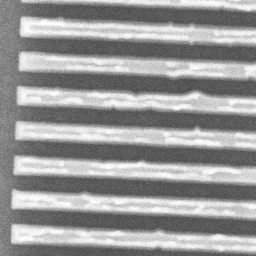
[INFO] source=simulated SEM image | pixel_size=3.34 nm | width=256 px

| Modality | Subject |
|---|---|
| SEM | parallel lines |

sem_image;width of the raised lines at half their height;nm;51.2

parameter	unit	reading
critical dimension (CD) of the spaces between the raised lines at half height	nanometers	64.1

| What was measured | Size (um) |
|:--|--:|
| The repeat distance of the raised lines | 0.115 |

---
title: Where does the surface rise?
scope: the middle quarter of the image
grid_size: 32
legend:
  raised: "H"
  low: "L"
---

HHHHHHHHHHHHHHHHHHHHHHHHHHHHHHHH
LHHHHHHHHHHHHHHHHHHHHHHHHHHHHHHH
LLLLLLLLLLLLLLLLLLLHHHHHHHHHHHHH
LLLLLLLLLLLLLLLLLLLLLLLLLLLLLLLL
LLLLLLLLLLLLLLLLLLLLLLLLLLLLLLLL
LLLLLLLLLLLLLLLLLLLLLLLLLLLLLLLL
LLLLLLLLLLLLLLLLLLLLLLLLLLLLLLLL
HHHHHHHHHHHHHHHHHLLLLLLLLLLLLLLH
HHHHHHHHHHHHHHHHHHHHHHHHHHHHHHHH
HHHHHHHHHHHHHHHHHHHHHHHHHHHHHHHH
LLLLLLLLHHHHHHHHHHHHHHHHHHHHHHHH
LLLLLLLLLLLLLLLLLLLLLLLLLLHLLLLH
LLLLLLLLLLLLLLLLLLLLLLLLLLLLLLLL
LLLLLLLLLLLLLLLLLLLLLLLLLLLLLLLL
LLLLLLLLLLLLLLLLLLLLLLLLLLLLLLLL
HHLLLLLLLLLLLLLLLLLLLLLLLLLLLLLL
HHHHHHHHHHHHHHHHHHHHHHHHHLLLLLLL
HHHHHHHHHHHHHHHHHHHHHHHHHHHHHHHH
HHHHHHHHHHHHHHHHHHHHHHHHHHHHHHHH
LLLLLLLLLLLHLLLLHHHHHHHHHHHHHHHH
LLLLLLLLLLLLLLLLLLLLLLLLLLLLLLLL
LLLLLLLLLLLLLLLLLLLLLLLLLLLLLLLL
LLLLLLLLLLLLLLLLLLLLLLLLLLLLLLLL
LLLLLLLLLLLLLLLLLLLLLLLLLLLLLLLL
HHHHHHHHHLLLLLLLLLLHLLLLLLLLLLLL
HHHHHHHHHHHHHHHHHHHHHHHHHHHHHHHH
HHHHHHHHHHHHHHHHHHHHHHHHHHHHHHHH
HHHHHHHHHHHHHHHHHHHHHHHHHHHHHHHH
LLLLLLLLLLLLLLLLLLLLHHHHHHHHHHHH
LLLLLLLLLLLLLLLLLLLLLLLLLLLLLLLL
LLLLLLLLLLLLLLLLLLLLLLLLLLLLLLLL
LLLLLLLLLLLLLLLLLLLLLLLLLLLLLLLL